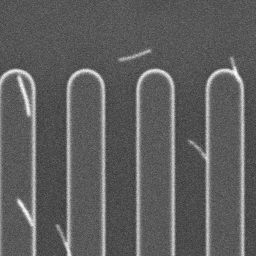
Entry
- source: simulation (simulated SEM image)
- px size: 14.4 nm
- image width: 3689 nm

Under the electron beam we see groups of lines, slits or small figures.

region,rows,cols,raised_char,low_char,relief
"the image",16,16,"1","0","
0000000000000000
0000000000000000
0000000000000000
0000000000000000
0000010001000010
1100110001100110
1100110001100110
1100110001100110
1100110001100110
1100110001100110
1100110001100110
1100110001100110
1100110001100110
1100110001100110
1100110001100110
1100110001100110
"